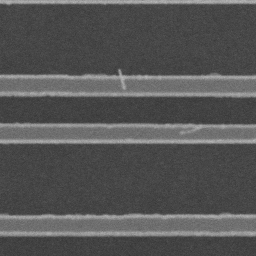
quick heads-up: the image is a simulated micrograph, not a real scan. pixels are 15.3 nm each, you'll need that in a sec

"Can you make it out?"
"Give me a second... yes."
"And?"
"lines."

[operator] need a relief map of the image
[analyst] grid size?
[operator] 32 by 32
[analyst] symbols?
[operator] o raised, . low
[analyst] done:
................................
................................
................................
................................
................................
................................
................................
................................
................................
oooo.ooo......oo................
oooooooooooooooooooooooooooooooo
oooooooooooooooooooooooooooooooo
................................
................................
................................
................................
oooooooooooooooooooooooooooooooo
oooooooooooooooooooooooooooooooo
................................
................................
................................
................................
................................
................................
................................
................................
................................
oooooooooooooooooooooooooooooooo
oooooooooooooooooooooooooooooooo
................................
................................
................................